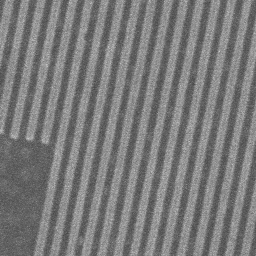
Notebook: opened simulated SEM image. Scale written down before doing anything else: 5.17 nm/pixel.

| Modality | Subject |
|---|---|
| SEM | parallel lines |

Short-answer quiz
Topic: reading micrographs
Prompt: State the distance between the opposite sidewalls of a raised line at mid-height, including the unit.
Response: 6.75 px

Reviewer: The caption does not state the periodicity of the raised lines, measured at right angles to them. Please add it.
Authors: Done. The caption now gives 0.0806 microns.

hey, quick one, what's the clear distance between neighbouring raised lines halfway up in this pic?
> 45 nanometers